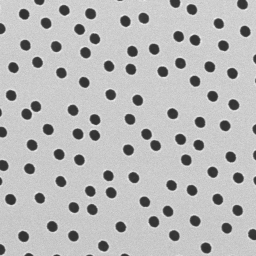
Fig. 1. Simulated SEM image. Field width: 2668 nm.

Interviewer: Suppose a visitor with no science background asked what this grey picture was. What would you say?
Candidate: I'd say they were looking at a regular array of holes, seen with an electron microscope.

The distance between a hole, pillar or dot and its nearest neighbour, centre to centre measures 228 nanometers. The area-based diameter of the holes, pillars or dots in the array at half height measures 113 nm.